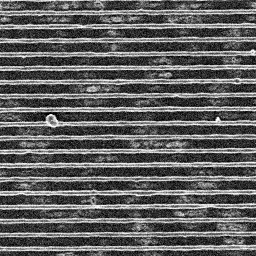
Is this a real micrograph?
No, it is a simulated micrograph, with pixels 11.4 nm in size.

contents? parallel lines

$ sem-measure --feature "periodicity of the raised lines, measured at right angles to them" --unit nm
158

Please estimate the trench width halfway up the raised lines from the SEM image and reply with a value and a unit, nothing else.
118 nanometers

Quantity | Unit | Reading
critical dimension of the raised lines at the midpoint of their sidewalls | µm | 0.0427